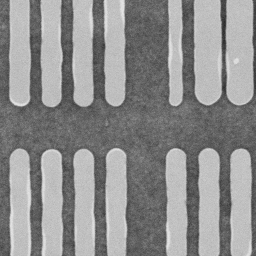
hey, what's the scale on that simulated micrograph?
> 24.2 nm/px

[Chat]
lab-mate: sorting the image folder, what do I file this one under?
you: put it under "groups of lines, slits or small figures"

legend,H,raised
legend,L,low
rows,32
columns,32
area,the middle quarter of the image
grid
LLHHHHHLLLHHHHHLLLLLLLLLLLHHHLLL
LLHHHHHLLLHHHHHLLLLLLLLLLLHHHLLL
LLHHHHHLLLHHHHHLLLLLLLLLLLLHHLLL
LLLHHHHLLLLHHHHLLLLLLLLLLLLHHLLL
LLLHHHHLLLHHHHHLLLLLLLLLLLLHHLLL
LLLHHHHLLLHHHHHLLLLLLLLLLLLHHHLL
LLLHHHHLLLHHHHHLLLLLLLLLLLLHHHLL
LLHHHHHLLLLHHHHLLLLLLLLLLLLHHHLL
LLHHHHHLLLLHHHHLLLLLLLLLLLHHHLLL
LLLHHHHLLLLHHHHLLLLLLLLLLLLHHLLL
LLLLLLLLLLLLLLLLLLLLLLLLLLLLLLLL
LLLLLLLLLLLLLLLLLLLLLLLLLLLLLLLL
LLLLLLLLLLLLLLLLLLLLLLLLLLLLLLLL
LLLLLLLLLLLLLLLLLLLLLLLLLLLLLLLL
LLLLLLLLLLLLLLLLLLLLLLLLLLLLLLLL
LLLLLLLLLLLLLLLLLLLLLLLLLLLLLLLL
LLLLLLLLLLLLLLLLLLLLLLLLLLLLLLLL
LLLLLLLLLLLLLLLLLLLLLLLLLLLLLLLL
LLLLLLLLLLLLLLLLLLLLLLLLLLLLLLLL
LLLLLLLLLLLLLLLLLLLLLLLLLLLLLLLL
LLLLLLLLLLLLLLLLLLLLLLLLLLLLLLLL
LLLLLLLLLLLLLLLLLLLLLLLLLLLHHLLL
LLLHHHHLLLLHHHHLLLLLLLLLLLHHHHLL
LLHHHHHLLLLHHHHLLLLLLLLLLLHHHHLL
LLHHHHHLLLLHHHHLLLLLLLLLLLHHHHLL
LLHHHHHLLLLHHHHLLLLLLLLLLLHHHHLL
LLLHHHHLLLLHHHHLLLLLLLLLLLHHHHLL
LLLHHHHLLLLHHHHLLLLLLLLLLLHHHHLL
LLLHHHHLLLLHHHHLLLLLLLLLLLHHHHLL
LLLHHHHLLLLHHHHHLLLLLLLLLLHHHHLL
LLLHHHHLLLLHHHHHLLLLLLLLLLHHHHLL
LLLHHHHLLLLHHHHHLLLLLLLLLLHHHHLL